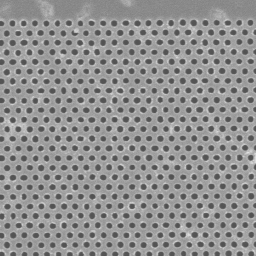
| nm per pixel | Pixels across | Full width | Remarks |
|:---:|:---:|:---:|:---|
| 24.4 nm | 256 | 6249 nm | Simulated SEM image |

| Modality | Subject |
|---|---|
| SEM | a regular array of holes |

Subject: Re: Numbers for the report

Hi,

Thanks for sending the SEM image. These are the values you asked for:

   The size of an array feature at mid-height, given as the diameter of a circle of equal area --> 156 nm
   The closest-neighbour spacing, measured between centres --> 0.262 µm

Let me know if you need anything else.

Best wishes